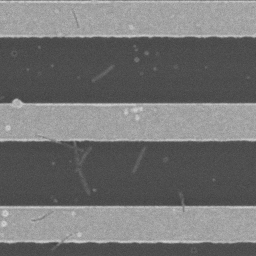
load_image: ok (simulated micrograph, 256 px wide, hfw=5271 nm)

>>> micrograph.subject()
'lines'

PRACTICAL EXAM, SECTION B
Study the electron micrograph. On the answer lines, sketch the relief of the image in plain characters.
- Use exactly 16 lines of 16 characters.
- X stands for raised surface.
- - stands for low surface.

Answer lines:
XXXXXXXXXXXXXXXX
XXXXXXXXXXXXXXXX
----------------
----------------
----------------
----------------
XX--------------
XXXXXXXXXXXXXXXX
XXXXXXXXXXXXXXXX
----------------
----------------
----------------
----------------
XXXXXXXXXXXXXXXX
XXXXXXXXXXXXXXXX
----------------